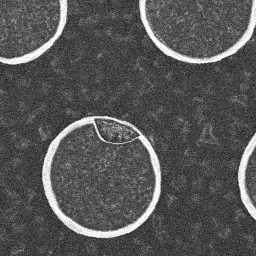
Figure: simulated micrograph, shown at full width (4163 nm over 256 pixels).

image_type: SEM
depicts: raised bodies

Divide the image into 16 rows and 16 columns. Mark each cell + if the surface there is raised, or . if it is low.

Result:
++++.....+++++++
++++.....+++++++
+++.......+++++.
++.........+++..
................
................
................
................
....++..........
...++++++......+
...+++++++.....+
...+++++++.....+
...+++++++.....+
....+++++.......
.....+++........
................